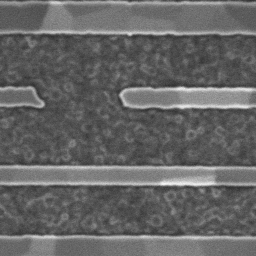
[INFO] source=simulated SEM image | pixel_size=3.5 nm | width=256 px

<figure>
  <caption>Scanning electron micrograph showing one or a few lines or trenches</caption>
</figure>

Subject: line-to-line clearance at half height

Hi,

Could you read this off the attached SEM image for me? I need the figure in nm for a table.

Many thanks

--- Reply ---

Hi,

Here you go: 187